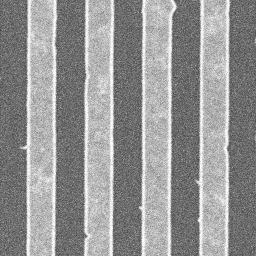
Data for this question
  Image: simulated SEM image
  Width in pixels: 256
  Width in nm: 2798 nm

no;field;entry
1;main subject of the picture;parallel lines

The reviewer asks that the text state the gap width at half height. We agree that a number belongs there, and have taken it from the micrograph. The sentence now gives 341 nm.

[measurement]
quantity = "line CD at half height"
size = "287 nm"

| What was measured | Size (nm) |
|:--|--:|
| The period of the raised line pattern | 630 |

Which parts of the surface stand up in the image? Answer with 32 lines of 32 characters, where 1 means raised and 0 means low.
00001110000111000011110001110000
00001110000111000011110001110000
00001110000111000011100001110000
00001110000111000011100001110000
00001110000111000011100001110000
00001110000111000011100001110000
00001110000111000011100001110000
00001110000111000011100001110000
00001110000111000011100001110000
00001110000111000011100001110000
00001110000111000011100001110000
00001110000111000011100001110000
00001110000111000011100001110000
00001110000111000011100001110000
00001110000111000011100001110000
00001110000111000011100001110000
00001110000111000011100001110000
00001110000111000011100001110000
00011110000111000011100001110000
00001110000111000011100001110000
00001110000111000011100001110000
00001110000111000011100001110000
00001110000111000011100001110000
00001110000111000011100001110000
00001110000111000011100001110000
00001110000111000011100001110000
00001110000111000011100001110000
00001110000111000011100001110000
00001110000111000011100001110000
00001110000111000011100001110000
00001110000111000011100001110000
00001110000111000011100001110000